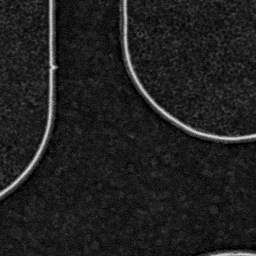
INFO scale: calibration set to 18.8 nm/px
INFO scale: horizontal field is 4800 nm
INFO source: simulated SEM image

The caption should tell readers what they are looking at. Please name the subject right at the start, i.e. one or a few lines or trenches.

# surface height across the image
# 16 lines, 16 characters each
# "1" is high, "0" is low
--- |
1110000011111111
1110000011111111
1110000011111111
1110000011111111
1110000011111111
1110000001111111
1110000000111111
1110000000011111
1110000000000111
1100000000000000
1100000000000000
1000000000000000
0000000000000000
0000000000000000
0000000000000000
0000000000000000